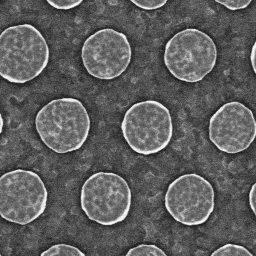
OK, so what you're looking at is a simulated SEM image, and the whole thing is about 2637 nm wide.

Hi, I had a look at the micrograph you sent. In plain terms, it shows raised bodies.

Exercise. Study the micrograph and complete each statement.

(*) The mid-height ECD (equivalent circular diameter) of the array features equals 516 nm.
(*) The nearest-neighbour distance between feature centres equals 854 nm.